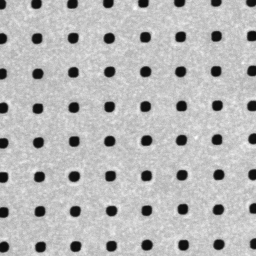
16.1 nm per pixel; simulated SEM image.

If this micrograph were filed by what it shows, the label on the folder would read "a regular array of holes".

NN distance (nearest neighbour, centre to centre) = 552 nanometers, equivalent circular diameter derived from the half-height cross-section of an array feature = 184 nanometres